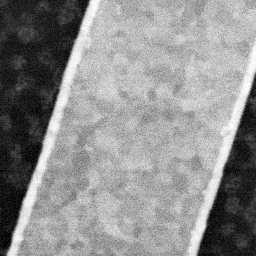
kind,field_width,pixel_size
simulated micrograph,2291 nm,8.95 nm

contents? one or a few lines or trenches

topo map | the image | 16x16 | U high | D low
DDDDDDUUUUUUUUUU
DDDDDUUUUUUUUUUU
DDDDDUUUUUUUUUUU
DDDDDUUUUUUUUUUU
DDDDUUUUUUUUUUUU
DDDDUUUUUUUUUUUD
DDDDUUUUUUUUUUUD
DDDDUUUUUUUUUUUD
DDDUUUUUUUUUUUDD
DDDUUUUUUUUUUUDD
DDDUUUUUUUUUUUDD
DDUUUUUUUUUUUDDD
DDUUUUUUUUUUUDDD
DDUUUUUUUUUUUDDD
DUUUUUUUUUUUDDDD
DUUUUUUUUUUUDDDD